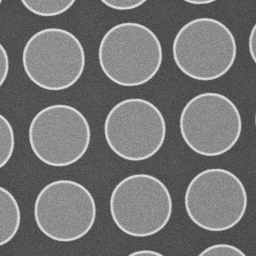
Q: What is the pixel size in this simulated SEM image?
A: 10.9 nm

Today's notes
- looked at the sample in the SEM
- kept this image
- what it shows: an array of small figures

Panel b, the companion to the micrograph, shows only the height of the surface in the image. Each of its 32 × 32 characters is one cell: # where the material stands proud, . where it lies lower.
...######....#####..............
....####........................
........................###.....
..............####.....#####....
....#####....######...#######..#
...#######...#######..#######..#
#..#######..########..#######..#
#..########.########..#######...
#..#######...#######...######...
#...######...######.....####....
.....####......###..............
................................
................##......#####...
......###.....#####....######...
.....#####...#######...#######..
#...#######..########..#######..
##..#######..########..#######..
##..#######..#######...#######..
##..#######...######....#####...
#....#####.....####.............
#.....###.......................
.........................####...
...............#####....######..
......#####...#######..#######..
##...######...#######..########.
##..########..#######..########.
##..########..#######..########.
##...#######..#######...######..
##...######....#####......###...
##....####.......#..............
................................
.................##......#####..